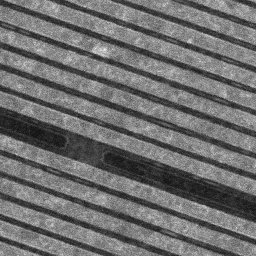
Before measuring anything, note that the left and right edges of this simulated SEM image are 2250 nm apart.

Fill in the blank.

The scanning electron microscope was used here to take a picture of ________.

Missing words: parallel lines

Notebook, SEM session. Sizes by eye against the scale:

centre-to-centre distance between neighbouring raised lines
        178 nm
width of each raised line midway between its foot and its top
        0.117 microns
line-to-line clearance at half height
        7.08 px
